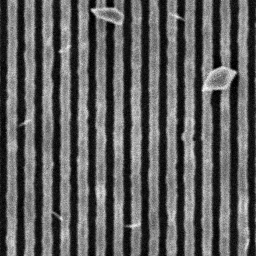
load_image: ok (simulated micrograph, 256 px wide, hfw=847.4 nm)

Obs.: parallel lines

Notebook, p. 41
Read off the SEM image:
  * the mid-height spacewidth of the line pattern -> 29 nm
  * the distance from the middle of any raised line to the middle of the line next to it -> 58.8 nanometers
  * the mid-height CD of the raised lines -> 29.4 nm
